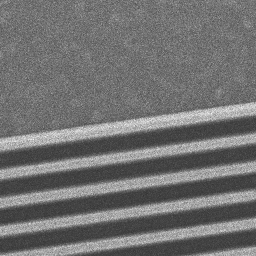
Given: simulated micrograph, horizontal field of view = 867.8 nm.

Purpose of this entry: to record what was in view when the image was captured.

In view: parallel lines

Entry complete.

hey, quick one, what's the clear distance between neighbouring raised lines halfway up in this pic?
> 0.0508 microns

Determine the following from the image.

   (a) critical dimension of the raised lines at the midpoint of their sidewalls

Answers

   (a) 44.9 nanometres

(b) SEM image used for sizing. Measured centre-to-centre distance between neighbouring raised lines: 95.3 nm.